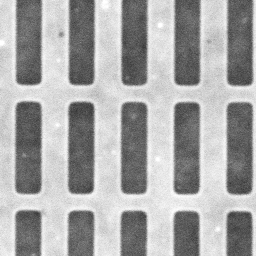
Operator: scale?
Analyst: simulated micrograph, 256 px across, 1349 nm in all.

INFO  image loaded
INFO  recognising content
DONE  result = groups of lines, slits or small figures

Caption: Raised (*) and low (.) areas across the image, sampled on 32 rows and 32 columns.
**...****...***....***...***....
**...****...***....***...***....
**...****...***....***...***....
**...****...***....***...***....
**...****...***....***...***....
**...****...***...****...***....
**...****...***...****...***....
**...***....***...****...***....
**...***....***...****...***....
**...****...***...****...***....
**...****...****..****...****..*
********************************
********************************
**...****...***...****...***....
**...***....***...****...***....
**...***....***...****...***....
**...***....***...****...***....
**...***....***...****...***....
**...***....***...****...***....
**...***....***...****...***....
**...***....***...****...***....
**...***....***...****...***....
**...***....***...****...***....
**...****...***...****...***....
********************************
********************************
**...****...***...****...****..*
**...***....***...****...***....
**...***....***...****...***....
**...***....***...****...***....
**...***....***...****...***....
**...***....***...****...***....